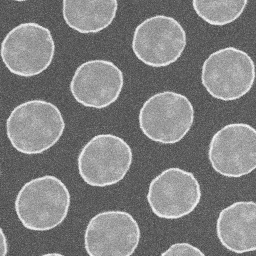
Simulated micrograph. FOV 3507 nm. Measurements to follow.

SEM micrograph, a regular array of raised bodies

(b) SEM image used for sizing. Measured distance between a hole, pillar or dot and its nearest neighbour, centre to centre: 1030 nanometers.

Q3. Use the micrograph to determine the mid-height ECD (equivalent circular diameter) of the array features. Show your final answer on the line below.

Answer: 707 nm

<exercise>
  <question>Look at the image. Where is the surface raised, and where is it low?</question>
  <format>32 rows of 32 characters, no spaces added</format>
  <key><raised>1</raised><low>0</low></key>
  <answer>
00000000111111000000000011111110
00000000111111000000000001111100
00000000111111000001110000111000
00111000011110000111111000000000
01111100000000000111111000000000
11111110000000000111111000000000
11111110000000000111111000011100
11111100000000000011110000111110
01111100001111100000000001111111
00000000011111100000000001111111
00000000011111100000000001111110
00000000011111100000000000111110
00000000001111000001111000000000
00111110000000000011111100000000
01111111000000000011111100000000
01111111000000000011111100000000
01111111000000000011111000011111
01111110000011100001110000011111
00111100000111110000000000111111
00000000001111110000000000111111
00000000001111110000000000011111
00000000001111110000011000011110
00001110000111100001111100000000
00011111000000000001111110000000
00111111100000000001111110000000
00111111100000000001111100000111
00111111000000000001111100001111
00011111000011111000000000011111
00001100000111111000000000011111
00000000000111111000000000011111
10000000000111111000000000001111
10000000000111110000011110000000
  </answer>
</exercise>